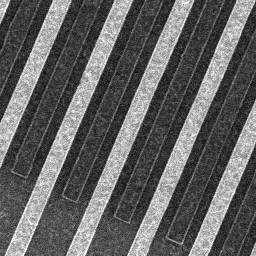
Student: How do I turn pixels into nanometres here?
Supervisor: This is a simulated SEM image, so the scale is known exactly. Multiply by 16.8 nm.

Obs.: parallel lines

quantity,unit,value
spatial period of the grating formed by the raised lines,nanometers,473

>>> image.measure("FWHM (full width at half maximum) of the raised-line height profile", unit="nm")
265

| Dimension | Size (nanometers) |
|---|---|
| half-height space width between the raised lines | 203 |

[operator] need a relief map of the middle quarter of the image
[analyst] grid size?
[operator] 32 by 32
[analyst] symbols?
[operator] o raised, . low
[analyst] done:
oo....oooo...ooooo...oooo....ooo
oo...ooooo...oooo...ooooo...oooo
o....oooo....oooo...ooooo...oooo
o....oooo...oooo....oooo...ooooo
o...oooo....oooo...ooooo...oooo.
....oooo...ooooo...oooo....oooo.
...oooo....oooo...ooooo...oooo..
...oooo...ooooo...oooo....oooo..
..ooooo...oooo...ooooo...oooo...
..oooo....oooo...ooooo...oooo...
..oooo...ooooo...oooo...ooooo...
.oooo....oooo...ooooo...oooo....
.oooo...ooooo...oooo....oooo...o
oooo....oooo....oooo...oooo....o
oooo...ooooo...oooo....oooo...oo
oooo...oooo....oooo...oooo....oo
ooo....oooo...ooooo...oooo....oo
ooo...ooooo...oooo...ooooo...ooo
oo....oooo...ooooo...oooo....ooo
oo...ooooo...oooo....oooo...oooo
o....oooo....oooo...oooo....oooo
o...ooooo...oooo....oooo...ooooo
o...oooo....oooo...oooo....oooo.
....oooo...oooo....oooo....oooo.
...ooooo...oooo...ooooo...oooo..
...oooo...ooooo...oooo....oooo..
..ooooo...oooo....oooo...ooooo..
..oooo....oooo...oooo....oooo...
.ooooo...oooo....oooo...ooooo...
.oooo....oooo...oooo....oooo....
ooooo...oooo....oooo....oooo...o
ooooo...oooo...ooooo...oooo....o